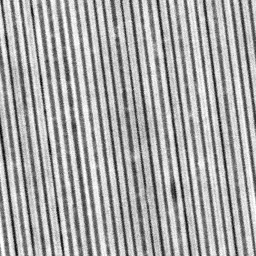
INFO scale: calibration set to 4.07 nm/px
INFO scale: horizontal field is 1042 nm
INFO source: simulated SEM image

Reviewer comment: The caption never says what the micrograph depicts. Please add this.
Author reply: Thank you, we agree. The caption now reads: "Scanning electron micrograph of parallel lines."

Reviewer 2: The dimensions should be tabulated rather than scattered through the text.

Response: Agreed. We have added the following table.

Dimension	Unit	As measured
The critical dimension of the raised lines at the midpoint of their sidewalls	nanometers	19.7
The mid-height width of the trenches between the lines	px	4.84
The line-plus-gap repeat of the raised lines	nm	37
